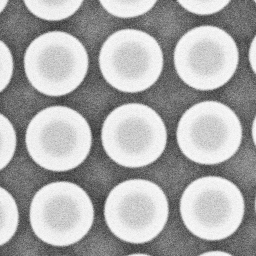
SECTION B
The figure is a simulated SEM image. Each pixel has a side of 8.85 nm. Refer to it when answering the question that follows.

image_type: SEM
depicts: an array of small figures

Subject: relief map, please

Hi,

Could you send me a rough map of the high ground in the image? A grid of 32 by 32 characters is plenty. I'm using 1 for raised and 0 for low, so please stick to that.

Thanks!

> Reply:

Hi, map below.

10011111110001111110000111110000
00001111100000111100000011100000
00000000000000000000000000000000
00000000000000000000000001100000
00000111100000111110000111111000
00001111110001111111001111111000
10011111111001111111001111111101
10011111111001111111001111111101
11011111111001111111001111111000
10011111111001111111000111111000
10001111110000111110000011110000
00000111100000000000000000000000
00000000000000000000000000000000
00000011000000011110000011110000
00000111110000111111000111111000
10001111111001111111001111111100
11011111111001111111101111111100
11011111111001111111101111111100
11011111111001111111000111111100
10001111111000111111000111111000
10000111110000011100000000000000
00000000000000000000000000000000
00000000000000000000000001110000
00000111110000111111000111111100
10001111111000111111100111111100
11001111111001111111100111111100
11001111111101111111100111111100
11001111111101111111100111111100
11001111111000111111000011111100
10000111110000011110000001110000
00000011100000000000000000000000
00000000000000000000000000010000